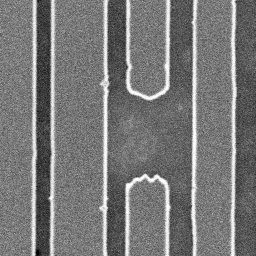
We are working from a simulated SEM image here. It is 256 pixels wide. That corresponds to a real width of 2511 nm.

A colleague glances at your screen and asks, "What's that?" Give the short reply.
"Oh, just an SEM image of one or a few lines or trenches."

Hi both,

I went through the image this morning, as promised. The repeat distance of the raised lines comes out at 662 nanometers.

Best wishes